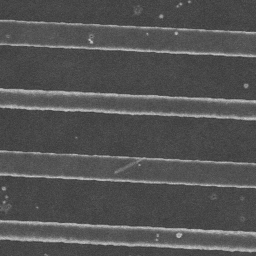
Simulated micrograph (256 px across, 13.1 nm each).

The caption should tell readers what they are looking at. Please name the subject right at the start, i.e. lines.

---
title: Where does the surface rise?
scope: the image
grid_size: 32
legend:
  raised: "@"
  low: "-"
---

--------------------------------
--------------------------------
--------------------------------
@@@@@@@@@@@@@@@@@@@-------------
@@@@@@@@@@@@@@@@@@@@@@@@@@@@@@@@
@@@@@@@@@@@@@@@@@@@@@@@@@@@@@@@@
-------------------@@@@@@@@@@@@@
--------------------------------
--------------------------------
--------------------------------
--------------------------------
@@@@@@@@------------------------
@@@@@@@@@@@@@@@@@@@@@@@@@@@@@@--
--@@@@@@@@@@@@@@@@@@@@@@@@@@@@@@
----------------------@@@@@@@@@@
--------------------------------
--------------------------------
--------------------------------
--------------------------------
@@@@@@@@@@@---------------------
@@@@@@@@@@@@@@@@@@@@@@@@@@@@@@@@
@@@@@@@@@@@@@@@@@@@@@@@@@@@@@@@@
------------@@@@@@@@@@@@@@@@@@@@
-------------------------------@
--------------------------------
--------------------------------
--------------------------------
--------------------------------
@@@@@@@@@@@@@@@@@@@@@-----------
@@@@@@@@@@@@@@@@@@@@@@@@@@@@@@@@
-----------@@@@@@@@@@@@@@@@@@@@@
--------------------------------